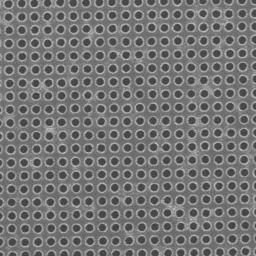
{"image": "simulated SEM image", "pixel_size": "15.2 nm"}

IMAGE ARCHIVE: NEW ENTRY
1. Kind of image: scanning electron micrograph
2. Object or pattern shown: a regular array of holes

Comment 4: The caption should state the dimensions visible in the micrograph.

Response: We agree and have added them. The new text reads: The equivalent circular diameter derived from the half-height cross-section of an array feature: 8.3 px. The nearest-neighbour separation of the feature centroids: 0.194 um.